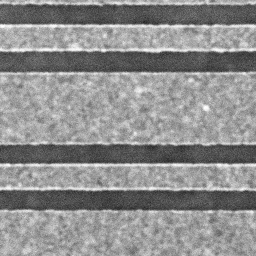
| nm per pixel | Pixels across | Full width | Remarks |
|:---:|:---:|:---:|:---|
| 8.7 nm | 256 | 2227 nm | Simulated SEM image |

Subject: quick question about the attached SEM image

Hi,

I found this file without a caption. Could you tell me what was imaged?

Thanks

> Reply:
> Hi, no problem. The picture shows lines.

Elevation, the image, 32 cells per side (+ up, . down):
.++.+..++++++++++++++++++.+++++.
................................
................................
++++++++++++++++++++++++++++++++
++++++++++++++++++++++++++++++++
++++++++++++++++++++++++++++++++
................................
................................
................................
++++++++++++++++++++++++++++++++
++++++++++++++++++++++++++++++++
++++++++++++++++++++++++++++++++
++++++++++++++++++++++++++++++++
++++++++++++++++++++++++++++++++
++++++++++++++++++++++++++++++++
++++++++++++++++++++++++++++++++
++++++++++++++++++++++++++++++++
++++++++++++++++++++++++++++++++
................................
................................
................................
++++++++++++++++++++++++++++++++
++++++++++++++++++++++++++++++++
++++++++++++++++++++++++++++++++
................................
................................
++++++++++++++++++++++++++++++++
++++++++++++++++++++++++++++++++
++++++++++++++++++++++++++++++++
++++++++++++++++++++++++++++++++
++++++++++++++++++++++++++++++++
++++++++++++++++++++++++++++++++